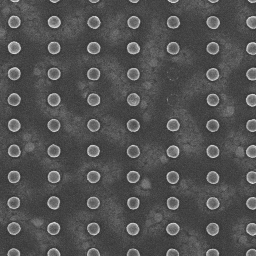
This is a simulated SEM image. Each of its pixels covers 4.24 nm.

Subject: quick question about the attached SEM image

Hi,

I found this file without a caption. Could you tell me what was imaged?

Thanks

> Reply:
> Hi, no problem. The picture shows a regular array of raised bodies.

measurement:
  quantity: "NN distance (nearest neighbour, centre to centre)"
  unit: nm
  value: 109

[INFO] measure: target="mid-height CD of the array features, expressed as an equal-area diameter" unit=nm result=52.4